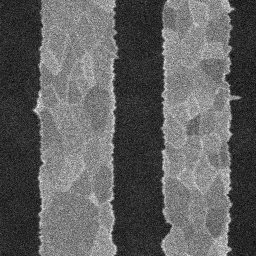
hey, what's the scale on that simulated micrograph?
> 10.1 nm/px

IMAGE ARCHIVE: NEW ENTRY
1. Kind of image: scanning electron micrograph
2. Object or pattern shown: one or a few lines or trenches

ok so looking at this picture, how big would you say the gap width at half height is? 507 nm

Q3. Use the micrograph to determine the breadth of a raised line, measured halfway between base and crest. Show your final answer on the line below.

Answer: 691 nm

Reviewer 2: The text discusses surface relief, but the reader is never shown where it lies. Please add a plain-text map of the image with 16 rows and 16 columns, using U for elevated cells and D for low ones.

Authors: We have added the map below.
DDDUUUUDDDUUUUDD
DDDUUUUDDDUUUUDD
DDDUUUUDDDUUUUDD
DDDUUUUDDDUUUUDD
DDDUUUUDDDUUUUDD
DDDUUUUDDDUUUUDD
DDUUUUUDDDUUUUDD
DDUUUUUDDDUUUUDD
DDDUUUUDDDUUUUDD
DDDUUUUDDDUUUUDD
DDDUUUUDDDUUUUDD
DDDUUUUDDDUUUUDD
DDDUUUUDDDUUUUDD
DDDUUUUDDDUUUUDD
DDUUUUUDDDDUUUDD
DDDUUUUDDDUUUUDD